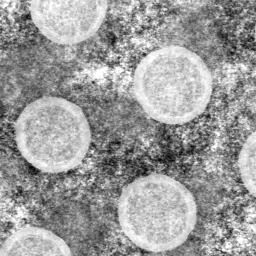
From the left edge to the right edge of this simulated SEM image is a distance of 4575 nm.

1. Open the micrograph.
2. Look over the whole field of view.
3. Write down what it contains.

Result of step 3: raised bodies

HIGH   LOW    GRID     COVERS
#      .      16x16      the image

..####..........
...###..........
................
.........###....
.........####...
.........####...
..##.....####...
.####...........
.####...........
.####..........#
...#...........#
........###.....
........####....
........####....
.##.....####....
####............